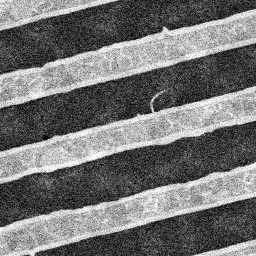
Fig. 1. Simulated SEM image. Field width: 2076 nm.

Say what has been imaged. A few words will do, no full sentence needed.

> one or a few lines or trenches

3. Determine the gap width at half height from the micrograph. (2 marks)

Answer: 389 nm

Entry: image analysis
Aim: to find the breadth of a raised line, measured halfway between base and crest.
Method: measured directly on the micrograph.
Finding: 214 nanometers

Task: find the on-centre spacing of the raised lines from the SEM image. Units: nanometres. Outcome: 603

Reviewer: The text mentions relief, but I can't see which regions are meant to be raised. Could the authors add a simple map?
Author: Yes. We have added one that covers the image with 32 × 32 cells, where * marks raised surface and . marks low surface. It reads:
************....................
********........................
****.........................***
.........................*******
....................************
................**************..
............**************......
.........*************..........
.....**************.............
.*************..................
**********......................
******.........................*
***........................*****
.......................*********
...................*************
...............*************....
...........**************.......
.......**************...........
...*************................
************....................
*********.......................
****.........................***
*.........................******
.....................***********
.................**************.
..............*************.....
..........*************.........
....***************.............
.**************.................
***********.....................
*******........................*
****........................****